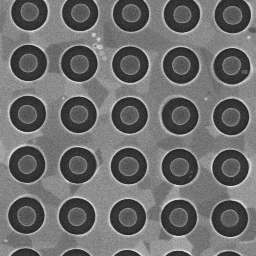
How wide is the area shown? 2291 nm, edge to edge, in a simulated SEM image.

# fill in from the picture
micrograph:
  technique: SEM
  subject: an array of small figures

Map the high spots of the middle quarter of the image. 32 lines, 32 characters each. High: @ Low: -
--@@@@--@@@@--@@@@@--@@@@--@@@@-
--@@@@--@@@@---@@@@--@@@@--@@@@-
--------@@@@@---@----@@@@-------
@------@@@@@@-------@@@@@@------
@@@--@@@@@@@@@@---@@@@@@@@@-----
@@@@@@@@@@@@@@@@@@@@@@@@@@@@@@@@
@@@@@@@@@@@@@@@@@@@@@@@@@@@@@@@@
@@@@@@@@@@@@@@@@@@@@@@@@@@@@@@@@
@@----@@@@@@@@@---@@@@@@@@----@@
-------@@@@@@-------@@@@@-------
--------@@@@--------@@@@@-------
--@@@@--@@@@---@@@---@@@----@@@-
--@@@@--@@@@--@@@@@--@@@---@@@@-
--@@@@--@@@@--@@@@---@@@---@@@@-
---@@---@@@@---@@@---@@@----@@@-
-------@@@@@@-------@@@@@-------
@-----@@@@@@@@-----@@@@@@@------
@@@@@@@@@@@@@@@@-@@@@@@@@@@---@@
@@@@@@@@@@@@@@@@@@@@@@@@@@@@@@@@
@@@@@@@@@@@@@@@@@@@@@@@@@@@@@@@@
@@@@@@@@@@@@@@@@@@@@@@@@@@@@@@@@
@-----@@@@@@@@-----@@@@@@@@----@
-------@@@@@@-------@@@@@@------
--@@@---@@@@---@@---@@@@@-------
-@@@@@--@@@@--@@@@---@@@---@@@@-
-@@@@@---@@@--@@@@@--@@@---@@@@-
--@@@---@@@@--@@@@---@@@---@@@@-
--------@@@@---@@---@@@@@---@@--
-------@@@@@@-------@@@@@-------
@----@@@@@@@@@-----@@@@@@@------
@@@@@@@@@@@@@@@@@@@@@@@@@@@@@-@@
@@@@@@@@@@@@@@@@@@@@@@@@@@@@@@@@